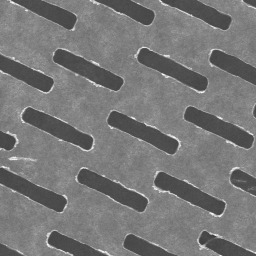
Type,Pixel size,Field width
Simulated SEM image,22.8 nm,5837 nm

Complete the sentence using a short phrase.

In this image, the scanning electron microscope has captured holes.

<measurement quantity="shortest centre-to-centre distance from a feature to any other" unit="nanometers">1500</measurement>